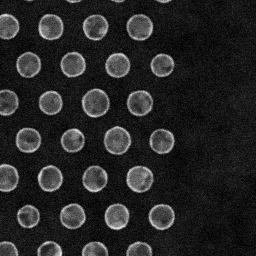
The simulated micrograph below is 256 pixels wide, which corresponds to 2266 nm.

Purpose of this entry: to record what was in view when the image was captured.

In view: a regular array of raised bodies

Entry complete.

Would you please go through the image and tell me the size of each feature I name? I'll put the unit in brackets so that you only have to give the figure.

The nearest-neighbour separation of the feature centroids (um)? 0.386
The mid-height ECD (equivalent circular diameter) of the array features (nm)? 216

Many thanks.